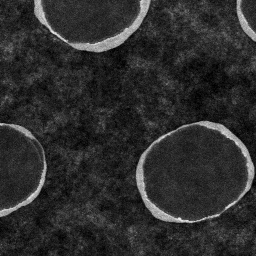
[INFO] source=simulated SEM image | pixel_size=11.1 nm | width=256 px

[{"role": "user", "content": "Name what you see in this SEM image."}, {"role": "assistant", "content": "raised bodies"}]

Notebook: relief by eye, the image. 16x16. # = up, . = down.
..#######......#
...######......#
....####........
................
................
................
................
................
##........#####.
###......######.
###......#######
###......######.
##.......######.
..........###...
................
................